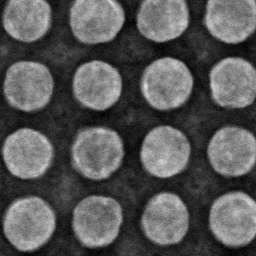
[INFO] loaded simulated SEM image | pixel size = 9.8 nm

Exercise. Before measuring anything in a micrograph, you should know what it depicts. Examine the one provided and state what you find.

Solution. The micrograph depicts a regular array of raised bodies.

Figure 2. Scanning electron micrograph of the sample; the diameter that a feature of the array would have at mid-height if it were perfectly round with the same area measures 493 nanometers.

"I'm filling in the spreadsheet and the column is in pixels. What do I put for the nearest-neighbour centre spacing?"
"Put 67.6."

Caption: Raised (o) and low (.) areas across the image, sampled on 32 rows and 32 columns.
.ooooo...oooooo...ooooo...oooooo
oooooo...oooooo..ooooooo..oooooo
oooooo...oooooo..ooooooo..oooooo
.ooooo...oooooo..oooooo...oooooo
.oooo.....oooo....oooo.....oooo.
................................
................................
....................oo......oo..
.ooooo....oooo....ooooo....ooooo
.ooooo...oooooo...oooooo..oooooo
ooooooo..oooooo...oooooo..oooooo
ooooooo..oooooo...oooooo...ooooo
.ooooo....ooooo...ooooo....ooooo
..ooo......oo......oo........o..
................................
................................
..ooo.....oooo.....oooo....oooo.
.ooooo...oooooo...ooooo...oooooo
oooooo...oooooo...oooooo..oooooo
ooooooo..oooooo...oooooo..oooooo
.ooooo...oooooo...ooooo...oooooo
.oooo.....oooo.....ooo.....oooo.
................................
................................
............o......ooo......ooo.
..oooo....ooooo....oooo....ooooo
.oooooo..oooooo...ooooo...oooooo
ooooooo..oooooo...oooooo..oooooo
ooooooo..oooooo...ooooo...oooooo
.ooooo....ooooo...ooooo....ooooo
..ooo......oo.......o.......ooo.
................................